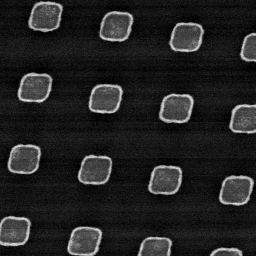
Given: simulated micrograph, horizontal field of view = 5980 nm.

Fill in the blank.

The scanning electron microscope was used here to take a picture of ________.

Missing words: a regular array of raised bodies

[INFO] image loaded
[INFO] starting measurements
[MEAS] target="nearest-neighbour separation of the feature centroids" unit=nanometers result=1670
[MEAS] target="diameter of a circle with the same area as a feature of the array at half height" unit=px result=31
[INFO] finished